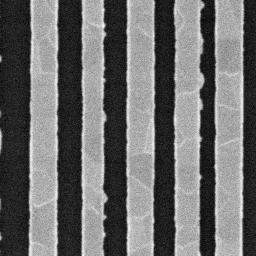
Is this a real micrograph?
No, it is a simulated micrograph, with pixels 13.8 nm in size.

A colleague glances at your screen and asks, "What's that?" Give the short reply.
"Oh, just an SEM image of lines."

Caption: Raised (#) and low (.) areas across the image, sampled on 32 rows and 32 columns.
....###...###...###...###..###..
....###...###...###...###..###..
....###...###...###...###..###..
....###...###...###...###..###..
....###...###...###...###..###..
....###...###...###...###..###..
....###...###...###...###..###..
....###...###...###...###..###..
....###...###...###...###..###..
....###...###...###...###..###..
....###...###...###...###..###..
....###...###...###...###..###..
....###...###...###...###..###..
....###...###...###...###..###..
....###...###...###...###..###..
....###...###...###...###..###..
....###...###...###...###..###..
....###...###...###...###..###..
....###...###...###...###..###..
....###...###...###...###..###..
....###...###...###...###..###..
....###...###...###...###..###..
....###...###...###...###..###..
....###...###...###...###..###..
....###...###...###...###..###..
....###...###...###...###..###..
....###...###...###...###..###..
....###...###...###...###..###..
....###...###...###...###..###..
....###...###...###...###..###..
....###...###...###...###..###..
....###...###...###...###..###..